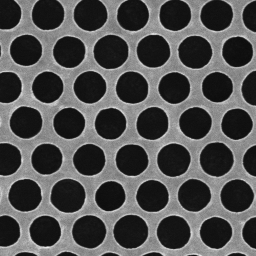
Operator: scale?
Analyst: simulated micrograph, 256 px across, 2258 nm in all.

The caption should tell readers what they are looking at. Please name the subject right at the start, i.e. a regular array of holes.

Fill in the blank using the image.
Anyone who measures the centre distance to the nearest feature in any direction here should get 364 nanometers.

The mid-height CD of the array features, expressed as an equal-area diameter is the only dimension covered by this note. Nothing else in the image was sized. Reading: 284 nm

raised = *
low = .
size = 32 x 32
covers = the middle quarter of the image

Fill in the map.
...******.....******....******..
********************************
****.....******....*******....**
***.......****......*****......*
***.......***........***.......*
**.........**........***........
**........***........***........
***.......***........***.......*
***......*****.......****......*
*****...*******....*******...***
********************************
...*******....******.....******.
....*****......****.......***...
.....***.......***........***...
.....***........**........***...
.....***........**........***...
.....***.......***........***...
....****.......****......*****..
..********...*******....*******.
********************************
*****...*******....******.....**
***.......****......****.......*
***.......***........***.......*
**........***........**.........
**........***........**.........
***.......***........***.......*
***......*****......****.......*
****....*******....******....***
********************************
....*******..*******....******..
....*****.....*****......****...
.....***.......****.......***...